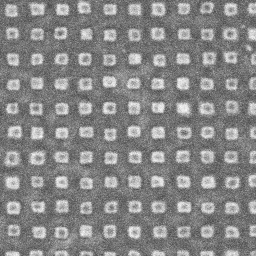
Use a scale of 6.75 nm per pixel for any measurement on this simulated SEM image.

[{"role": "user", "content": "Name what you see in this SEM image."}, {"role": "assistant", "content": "a regular array of raised bodies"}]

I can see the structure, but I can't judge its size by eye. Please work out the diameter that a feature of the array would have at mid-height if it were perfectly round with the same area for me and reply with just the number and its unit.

78.4 nm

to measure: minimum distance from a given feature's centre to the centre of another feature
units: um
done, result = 0.158